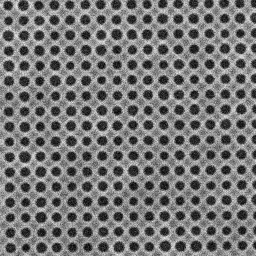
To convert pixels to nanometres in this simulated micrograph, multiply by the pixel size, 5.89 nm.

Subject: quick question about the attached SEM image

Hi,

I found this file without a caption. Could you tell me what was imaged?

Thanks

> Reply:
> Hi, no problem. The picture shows a regular array of holes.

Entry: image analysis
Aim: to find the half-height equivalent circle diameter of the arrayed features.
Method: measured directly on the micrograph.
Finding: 63.4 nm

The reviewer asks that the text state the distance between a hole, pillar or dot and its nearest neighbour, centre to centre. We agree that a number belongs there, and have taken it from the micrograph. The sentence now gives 0.0881 microns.